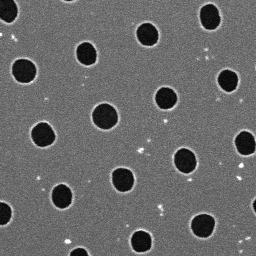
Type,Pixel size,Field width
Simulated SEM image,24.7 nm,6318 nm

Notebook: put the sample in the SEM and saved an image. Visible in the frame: a regular array of holes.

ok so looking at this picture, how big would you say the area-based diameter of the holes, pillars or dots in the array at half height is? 584 nanometres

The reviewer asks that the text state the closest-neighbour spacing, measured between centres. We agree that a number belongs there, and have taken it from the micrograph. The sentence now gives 1580 nm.